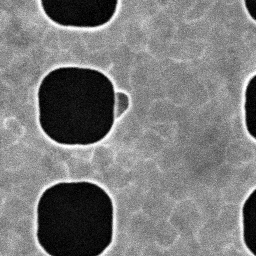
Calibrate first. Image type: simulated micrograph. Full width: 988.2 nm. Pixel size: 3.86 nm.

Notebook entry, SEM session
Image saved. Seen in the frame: holes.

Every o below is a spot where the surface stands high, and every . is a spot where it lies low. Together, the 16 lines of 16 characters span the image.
ooo....oooooooo.
oooo...ooooooooo
oooooooooooooooo
oooooooooooooooo
ooo...oooooooooo
oo.....oooooooo.
oo.....oooooooo.
oo.....oooooooo.
ooo....ooooooooo
oooooooooooooooo
oooooooooooooooo
oooo..oooooooooo
oo.....oooooooo.
oo.....oooooooo.
oo.....oooooooo.
ooo....ooooooooo